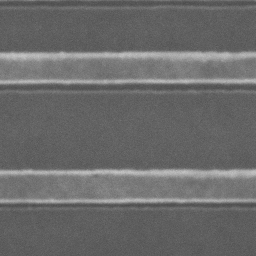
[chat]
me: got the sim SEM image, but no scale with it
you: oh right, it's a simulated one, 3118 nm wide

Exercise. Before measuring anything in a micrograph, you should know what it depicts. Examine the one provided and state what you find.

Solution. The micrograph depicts lines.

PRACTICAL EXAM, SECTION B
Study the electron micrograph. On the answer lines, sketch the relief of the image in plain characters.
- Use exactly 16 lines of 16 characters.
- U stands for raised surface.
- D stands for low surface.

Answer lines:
DDDDDDDDDDDDDDDD
DDDDDDDDDDDDDDDD
DDDDDDDDDDDDDDDD
UUUUUUUUUUUUUUUU
UUUUUUUUUUUUUUUU
DDDDDDDDDDDDDDDD
DDDDDDDDDDDDDDDD
DDDDDDDDDDDDDDDD
DDDDDDDDDDDDDDDD
DDDDDDDDDDDDDDDD
DDDDDDDDDDDDDDDD
UUUUUUUUUUUUUUUU
UUUUUUUUUUUUUUUU
DDDDDDDDDDDDDDDD
DDDDDDDDDDDDDDDD
DDDDDDDDDDDDDDDD